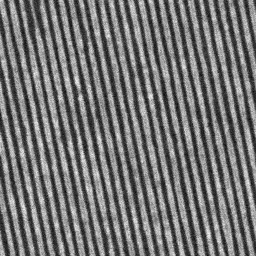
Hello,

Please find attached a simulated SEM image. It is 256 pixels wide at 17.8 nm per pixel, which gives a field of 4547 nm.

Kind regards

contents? parallel lines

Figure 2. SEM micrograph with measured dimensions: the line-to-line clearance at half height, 120 nm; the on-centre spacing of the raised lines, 174 nm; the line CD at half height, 58.8 nanometres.